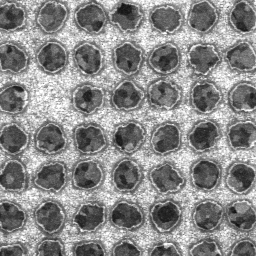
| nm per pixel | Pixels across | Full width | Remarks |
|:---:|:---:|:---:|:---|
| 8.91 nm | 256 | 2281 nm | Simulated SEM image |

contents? a regular array of raised bodies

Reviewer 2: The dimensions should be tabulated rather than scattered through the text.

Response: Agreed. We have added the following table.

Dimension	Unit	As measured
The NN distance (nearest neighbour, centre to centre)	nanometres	331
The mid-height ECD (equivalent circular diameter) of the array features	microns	0.257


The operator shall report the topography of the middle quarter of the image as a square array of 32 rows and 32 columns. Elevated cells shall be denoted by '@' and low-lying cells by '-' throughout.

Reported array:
----@@@@@----@@@@@@---@@@@@@----
----@@@@@-----@@@@-----@@@@-----
-----@@@--------@---------------
--------------------------------
---------------@@-------@@------
-----@--------@@@@----@@@@@-----
---@@@@@@----@@@@@@--@@@@@@@@---
--@@@@@@@@--@@@@@@@@-@@@@@@@@---
--@@@@@@@@--@@@@@@@---@@@@@@@---
--@@@@@@@@--@@@@@@@---@@@@@@----
---@@@@@@----@@@@@-----@@@@-----
----@@@@------------------------
--------------------------------
--------------------------------
--------------------------------
---------------@@@@------@@@----
---@@@@@@----@@@@@@@---@@@@@@---
---@@@@@@@---@@@@@@@---@@@@@@--@
---@@@@@@@---@@@@@@@--@@@@@@@--@
---@@@@@@@---@@@@@@@--@@@@@@@--@
---@@@@@@@---@@@@@@---@@@@@@@---
----@@@@@------@@@-----@@@@-----
--------------------------------
--------------------------------
----@@@@------@@@---------------
---@@@@@@----@@@@@------@@@-----
---@@@@@@----@@@@@@---@@@@@@----
--@@@@@@@----@@@@@@---@@@@@@@---
--@@@@@@@----@@@@@@---@@@@@@@@--
---@@@@@@----@@@@@@---@@@@@@@@--
---@@@@@-----@@@@@-----@@@@@@---
---------------@--------@@@@----